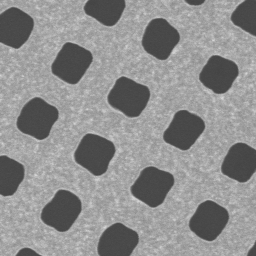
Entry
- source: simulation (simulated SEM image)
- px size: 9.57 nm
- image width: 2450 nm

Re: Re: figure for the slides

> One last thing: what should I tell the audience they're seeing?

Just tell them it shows a regular array of holes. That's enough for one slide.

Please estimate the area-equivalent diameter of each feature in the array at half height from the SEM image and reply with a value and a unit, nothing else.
373 nm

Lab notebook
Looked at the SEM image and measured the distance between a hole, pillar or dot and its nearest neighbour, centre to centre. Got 627 nm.